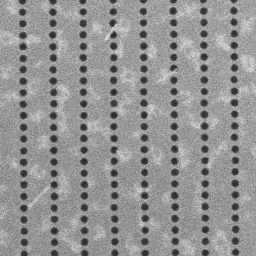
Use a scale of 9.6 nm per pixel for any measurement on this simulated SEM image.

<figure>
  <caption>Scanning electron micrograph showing a regular array of holes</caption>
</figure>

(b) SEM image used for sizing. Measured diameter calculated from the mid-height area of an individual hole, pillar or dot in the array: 0.0735 micrometres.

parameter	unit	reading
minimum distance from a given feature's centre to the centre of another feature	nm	108